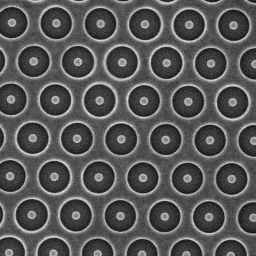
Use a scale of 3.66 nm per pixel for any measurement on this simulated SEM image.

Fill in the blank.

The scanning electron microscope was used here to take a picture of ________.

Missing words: an array of small figures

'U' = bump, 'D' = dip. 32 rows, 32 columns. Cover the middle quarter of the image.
DDDDDDDDUUDDDDDDDDDUUUDDDDDDDDUU
DDDDDDDUUUUDDDDDDDUUUUDDDDDDDUUU
UDDDDDDUUUUDDDDDDUUUUUUDDDDDDUUU
UUUDDUUUUUUUUDDDUUUUUUUUDDDUUUUU
UUUUUUUUUUUUUUUUUUUUUUUUUUUUUUUU
UUUUUUUDDDDUUUUUUUDDDDUUUUUUUUDD
DUUUUUDDDDDDUUUUUDDDDDDUUUUUDDDD
DDUUUDDDDDDDDUUUDDDDDDDDUUUDDDDD
DDUUUDDDDDDDDUUUDDDDDDDDUUUDDDDD
DDUUUDDDDDDDDUUUDDDDDDDDUUUDDDDD
DDUUUDDDDDDDDUUUDDDDDDDDUUUDDDDD
DUUUUDDDDDDDUUUUUDDDDDDUUUUUDDDD
UUUUUUDDDDDUUUUUUUDDDDUUUUUUDDDD
UUUUUUUUUUUUUUUUUUUUUUUUUUUUUUDD
UUUDUUUUUUUUUUUUUUUUUUUUUUUUUUUU
UDDDDDUUUUUUDDDDDUUUUUUDDDDDUUUU
DDDDDDDUUUUDDDDDDDUUUUDDDDDDDUUU
DDDDDDDUUUDDDDDDDDUUUUDDDDDDDUUU
DDDDDDDUUUDDDDDDDDUUUDDDDDDDDUUU
DDDDDDDUUUDDDDDDDDUUUUDDDDDDDUUU
DDDDDDDUUUUDDDDDDDUUUUDDDDDDDUUU
DDDDDDUUUUUDDDDDDUUUUUDDDDDDUUUU
UUDDUUUUUUUUUDDDUUUUUUUUDDDUUUUU
UUUUUUUUUUUUUUUUUUUUUUUUUUUUUUUU
UUUUUUUUDDUUUUUUUUUDUUUUUUUUUUUU
DUUUUUDDDDDDUUUUUDDDDDUUUUUUDDDD
DUUUUDDDDDDDUUUUDDDDDDDUUUUDDDDD
DDUUUDDDDDDDDUUUDDDDDDDDUUUDDDDD
DDUUDDDDDDDDDUUUDDDDDDDDUUUDDDDD
DDUUUDDDDDDDDUUUDDDDDDDDUUUDDDDD
DUUUUDDDDDDDUUUUDDDDDDDUUUUDDDDD
UUUUUUDDDDDUUUUUUDDDDDUUUUUUDDDD